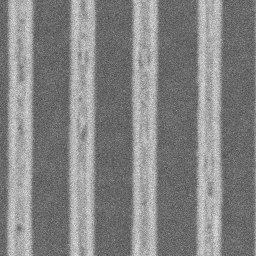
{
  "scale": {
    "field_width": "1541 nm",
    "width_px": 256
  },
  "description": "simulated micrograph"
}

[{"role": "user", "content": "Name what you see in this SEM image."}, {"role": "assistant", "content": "one or a few lines or trenches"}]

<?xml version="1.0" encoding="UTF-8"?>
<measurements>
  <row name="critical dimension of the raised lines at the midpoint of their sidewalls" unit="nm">105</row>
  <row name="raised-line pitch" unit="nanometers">380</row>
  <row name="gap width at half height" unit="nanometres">266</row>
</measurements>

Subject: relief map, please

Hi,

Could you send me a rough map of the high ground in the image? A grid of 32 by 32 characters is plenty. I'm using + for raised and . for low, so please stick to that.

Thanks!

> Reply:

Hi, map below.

.+++.....++......++......++.....
..++.....++......++......++.....
..++.....++......++......++.....
..++.....++......++......++.....
..++.....++......++......++.....
..++.....++......++......++.....
..++.....++......++......++.....
..++.....++......++......++.....
..++.....++......++......++.....
..++.....++......++......++.....
..++.....++......++......++.....
..++.....++......++......++.....
..++.....++......++......++.....
..++.....++......++......++.....
..+......++......++......++.....
..++.....++......++......++.....
..++.....++......++......++.....
..++.....++......++......++.....
..++.....++......++......++.....
..++.....++......++......++.....
..++.....++......++......++.....
..++.....++......++......++.....
..++.....++......++......++.....
..+......++......++......++.....
.++......++......++......++.....
.++......++......++......++.....
.++......++......++......++.....
.+++.....++......++......++.....
.+++.....++......++......++.....
.+++.....++......++......++.....
.+++.....++......++......++.....
.+++.....++......++......++.....